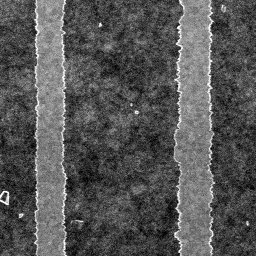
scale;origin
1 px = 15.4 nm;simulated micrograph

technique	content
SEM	one or a few lines or trenches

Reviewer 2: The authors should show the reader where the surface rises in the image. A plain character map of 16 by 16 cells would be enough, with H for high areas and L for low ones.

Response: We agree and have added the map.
LLHHLLLLLLLHHLLL
LLHHLLLLLLLHHLLL
LLHHLLLLLLLHHLLL
LLHHLLLLLLLHHLLL
LLHHLLLLLLLHHLLL
LLHHLLLLLLLHHLLL
LLHHLLLLLLLHHLLL
LLHHLLLLLLLHHLLL
LLHHLLLLLLLHHLLL
LLHHLLLLLLLHHLLL
LLHHLLLLLLLHHLLL
LLHHLLLLLLLHHLLL
LLHHLLLLLLLHHLLL
LLHHLLLLLLLHHLLL
LLHHLLLLLLLHHLLL
LLHHLLLLLLLHHLLL